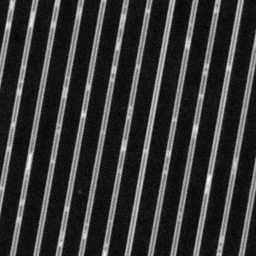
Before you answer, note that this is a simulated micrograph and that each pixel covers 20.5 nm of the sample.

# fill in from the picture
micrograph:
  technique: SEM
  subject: parallel lines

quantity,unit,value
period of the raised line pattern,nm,461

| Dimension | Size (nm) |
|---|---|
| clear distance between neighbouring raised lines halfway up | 356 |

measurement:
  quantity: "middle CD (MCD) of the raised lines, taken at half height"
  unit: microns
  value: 0.0984